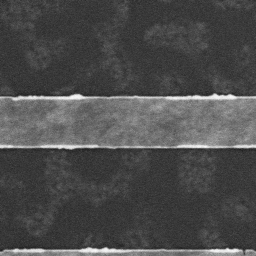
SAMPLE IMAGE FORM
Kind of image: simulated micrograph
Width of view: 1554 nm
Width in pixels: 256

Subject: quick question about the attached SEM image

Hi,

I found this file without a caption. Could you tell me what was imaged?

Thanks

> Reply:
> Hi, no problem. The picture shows one or a few lines or trenches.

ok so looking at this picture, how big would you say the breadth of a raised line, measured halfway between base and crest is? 308 nm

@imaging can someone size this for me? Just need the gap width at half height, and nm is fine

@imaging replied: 621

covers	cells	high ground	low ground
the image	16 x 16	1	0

0000000000000000
0000000000000000
0000000000000000
0000000000000000
0000000000000000
0000000000000000
1111111111111111
1111111111111111
1111111111111111
0000000000000000
0000000000000000
0000000000000000
0000000000000000
0000000000000000
0000000000000000
0000000000000000